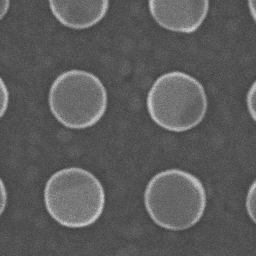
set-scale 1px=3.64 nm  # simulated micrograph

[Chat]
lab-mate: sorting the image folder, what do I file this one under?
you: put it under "raised bodies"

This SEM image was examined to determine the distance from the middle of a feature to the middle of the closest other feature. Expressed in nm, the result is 357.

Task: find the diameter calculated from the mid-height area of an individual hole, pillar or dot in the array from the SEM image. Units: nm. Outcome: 214